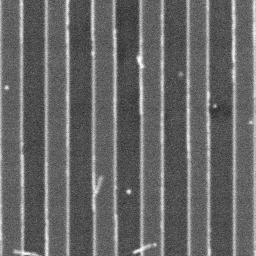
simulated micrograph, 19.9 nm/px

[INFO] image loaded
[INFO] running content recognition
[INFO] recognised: lines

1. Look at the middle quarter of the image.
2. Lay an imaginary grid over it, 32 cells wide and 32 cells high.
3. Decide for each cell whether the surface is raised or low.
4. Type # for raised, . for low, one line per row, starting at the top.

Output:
#......######......######......#
#......######......######......#
#......######......######......#
#......######......######......#
#......######......######......#
#......######......######......#
#......######......######......#
#......######......######......#
#......######......######......#
#......######......######......#
#......######......######......#
#......######......######......#
#......######......######......#
#......######......######......#
#......######......######......#
#......######......######......#
#......######......######......#
#......######......######......#
#......######......######......#
#......######......######......#
#......######......######......#
#......######......######......#
#......######......######......#
#......######......######......#
#......######......######......#
#......######......######......#
#......######......######......#
#......######......######......#
#......######......######......#
#......######......######......#
#......######......######......#
#......######......######......#